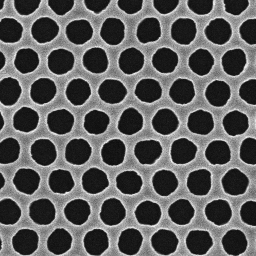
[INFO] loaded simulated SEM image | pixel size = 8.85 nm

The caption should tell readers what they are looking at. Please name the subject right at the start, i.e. a regular array of holes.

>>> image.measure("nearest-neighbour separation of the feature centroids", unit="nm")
300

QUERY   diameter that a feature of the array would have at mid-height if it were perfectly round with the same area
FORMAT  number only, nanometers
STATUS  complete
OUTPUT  228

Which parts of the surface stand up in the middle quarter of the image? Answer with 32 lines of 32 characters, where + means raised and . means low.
..+++......+++......++......+++.
..++++....++++.....++++.....++++
+++++++++++++++..+++++++++++++++
++++++++++++++++++++++++++++++++
++....++++....+++++.....++++....
+.....+++......+++......+++.....
.......++.......++......++......
.......++.......++......++......
+.....+++......+++......+++.....
++...+++++....++++++..++++++...+
++++++++++++++++++++++++++++++++
.++++++++++++++...++++++...+++++
..+++......++++....++++.....++++
..+++......+++......++......+++.
..+++......+++......++.......++.
..+++......+++......++......+++.
..+++......+++.....++++.....+++.
+++++++..++++++...++++++..++++++
++++++++++++++++++++++++++++++++
+.....+++++....+++......+++.....
+......+++.....+++......+++.....
.......++......+++.......++.....
.......++......+++......+++.....
......++++.....+++.....++++.....
+.....++++.....++++....++++....+
++++++++++++++++++++++++++++++++
++++++...+++++++++++++++..++++++
..+++.....++++....+++++.....+++.
..++.......++......+++......+++.
..++.......++.......++.......++.
..+++......++......+++......+++.
..+++.....++++.....++++.....+++.